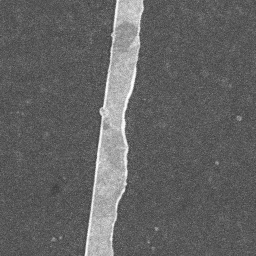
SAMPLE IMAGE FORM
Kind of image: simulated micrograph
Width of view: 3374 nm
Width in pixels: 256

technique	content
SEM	one or a few lines or trenches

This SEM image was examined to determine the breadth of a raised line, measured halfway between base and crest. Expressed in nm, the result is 335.